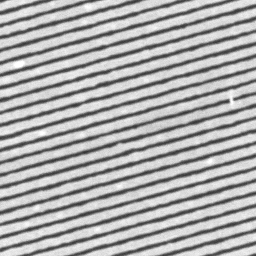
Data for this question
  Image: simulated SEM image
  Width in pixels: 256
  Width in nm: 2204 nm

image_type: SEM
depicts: parallel lines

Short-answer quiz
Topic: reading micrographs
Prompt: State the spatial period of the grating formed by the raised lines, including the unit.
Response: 104 nm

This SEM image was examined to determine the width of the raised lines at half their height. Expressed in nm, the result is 62.3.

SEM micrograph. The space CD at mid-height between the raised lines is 4.46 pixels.